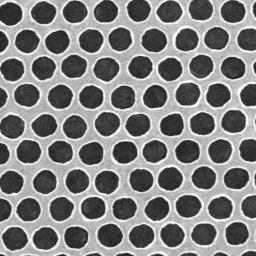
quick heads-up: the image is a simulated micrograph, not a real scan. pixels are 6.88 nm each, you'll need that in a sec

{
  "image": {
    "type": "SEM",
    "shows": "a regular array of holes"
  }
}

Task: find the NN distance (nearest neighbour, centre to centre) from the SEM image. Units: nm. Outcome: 208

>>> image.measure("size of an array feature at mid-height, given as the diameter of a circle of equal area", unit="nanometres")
168